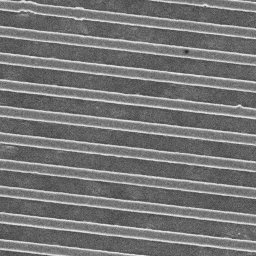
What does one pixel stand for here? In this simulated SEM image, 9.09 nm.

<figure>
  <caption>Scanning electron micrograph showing parallel lines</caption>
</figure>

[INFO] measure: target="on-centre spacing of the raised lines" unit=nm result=240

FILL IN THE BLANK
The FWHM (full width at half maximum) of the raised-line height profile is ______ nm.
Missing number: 91.5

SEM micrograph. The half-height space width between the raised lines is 149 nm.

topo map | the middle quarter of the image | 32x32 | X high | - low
XXXXXXXXXXXXX-------------------
XXXXXXXXXXXXXXXXXXXXX-----------
-------XXXXXXXXXXXXXXXXXXXXXXX--
-----------------XXXXXXXXXXXXXXX
---------------------------XXXXX
--------------------------------
XXXXXXX-------------------------
XXXXXXXXXXXXXXX-----------------
---XXXXXXXXXXXXXXXXXXXXX--------
------------XXXXXXXXXXXXXXXXXXXX
---------------------XXXXXXXXXXX
------------------------------XX
--------------------------------
XXXXXXXXX-----------------------
XXXXXXXXXXXXXXXXXXX-------------
------XXXXXXXXXXXXXXXXXXXXX-----
---------------XXXXXXXXXXXXXXXXX
------------------------XXXXXXXX
--------------------------------
XXX-----------------------------
XXXXXXXXXXXX--------------------
XXXXXXXXXXXXXXXXXXXXX-----------
---------XXXXXXXXXXXXXXXXXXXXXXX
-----------------XXXXXXXXXXXXXXX
--------------------------XXXXXX
--------------------------------
XXXXXXX-------------------------
XXXXXXXXXXXXXXXX----------------
---XXXXXXXXXXXXXXXXXXXXXX-------
-----------XXXXXXXXXXXXXXXXXXXXX
--------------------XXXXXXXXXXXX
-----------------------------XXX